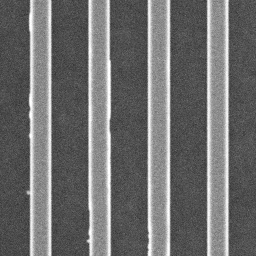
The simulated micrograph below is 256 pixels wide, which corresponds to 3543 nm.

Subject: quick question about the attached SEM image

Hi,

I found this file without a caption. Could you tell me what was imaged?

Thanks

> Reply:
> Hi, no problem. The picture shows lines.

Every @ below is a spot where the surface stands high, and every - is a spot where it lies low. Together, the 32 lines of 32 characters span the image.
----@@-----@@@-----@@-----@@----
----@@-----@@@-----@@-----@@----
----@@-----@@@-----@@-----@@----
----@@-----@@@-----@@-----@@----
----@@-----@@@-----@@-----@@----
----@@-----@@@-----@@-----@@----
----@@-----@@@-----@@-----@@----
----@@-----@@@-----@@-----@@----
----@@-----@@@-----@@-----@@----
----@@-----@@@-----@@-----@@----
----@@-----@@@-----@@-----@@----
----@@-----@@@-----@@-----@@----
----@@-----@@@-----@@-----@@----
----@@-----@@@-----@@-----@@----
----@@-----@@@-----@@-----@@----
----@@-----@@@-----@@-----@@----
----@@-----@@@-----@@-----@@----
----@@-----@@@-----@@-----@@----
----@@-----@@@-----@@-----@@----
----@@-----@@@-----@@-----@@----
----@@-----@@@-----@@-----@@----
----@@-----@@@-----@@-----@@----
----@@-----@@@-----@@-----@@----
----@@-----@@@-----@@-----@@----
----@@-----@@@-----@@-----@@----
----@@-----@@@-----@@-----@@----
----@@-----@@@-----@@-----@@----
----@@-----@@@-----@@-----@@----
----@@-----@@@-----@@-----@@----
----@@-----@@@-----@@-----@@----
----@@-----@@@-----@@-----@@----
----@@-----@@@-----@@-----@@----